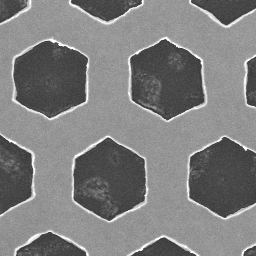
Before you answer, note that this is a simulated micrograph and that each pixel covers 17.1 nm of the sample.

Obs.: holes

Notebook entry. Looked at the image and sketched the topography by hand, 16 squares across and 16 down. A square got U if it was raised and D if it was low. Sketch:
DDUUUDDDUUUUUDDD
UUUUUUUUUUUUUUUU
UUUUUUUUUUUUUUUU
UDDDDUUUDDDDUUUU
UDDDDUUUDDDDDUUD
UDDDDUUUDDDDDUUD
UDDDDUUUUDDDDUUU
UUUUUUUUUUUUUUUU
UUUUUUUUUUUUUUUU
DDUUUDDDUUUUDDDD
DDUUUDDDDUUUDDDD
DDUUUDDDDUUUDDDD
DDUUUDDDDUUUDDDD
UUUUUUDUUUUUUUUU
UUUUUUUUUUUUUUUU
UDDDDUUUUDDUUUUU